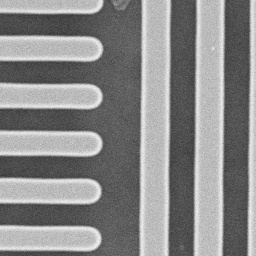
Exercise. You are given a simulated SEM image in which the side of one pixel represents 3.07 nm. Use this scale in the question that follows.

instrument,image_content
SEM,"groups of lines, slits or small figures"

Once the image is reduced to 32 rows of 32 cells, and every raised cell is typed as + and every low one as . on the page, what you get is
+++++++++++++.....+++....+++...+
++++++++++++......+++....+++...+
..................+++....+++...+
..................+++....+++...+
..................+++....+++...+
+++++++++++++.....+++....+++...+
+++++++++++++.....+++....+++...+
++++++++++++......+++....+++...+
..................+++....+++...+
..................+++....+++...+
+++...............+++....+++...+
+++++++++++++.....+++....+++...+
+++++++++++++.....+++....+++...+
.........+++......+++....+++...+
..................+++....+++...+
..................+++....+++...+
++................+++....+++...+
+++++++++++++.....+++....+++...+
+++++++++++++.....+++....+++...+
..................+++....+++...+
..................+++...++++...+
..................+++...++++...+
+++++++++++.......+++...++++...+
++++++++++++......+++...++++...+
++++++++++++......+++...++++...+
..................+++...++++...+
..................+++...++++...+
..................+++...++++...+
+++++++++++.......+++...++++...+
++++++++++++......+++...++++...+
++++++++++++......+++...++++...+
..................+++...++++...+